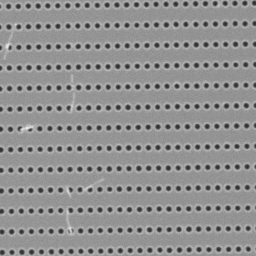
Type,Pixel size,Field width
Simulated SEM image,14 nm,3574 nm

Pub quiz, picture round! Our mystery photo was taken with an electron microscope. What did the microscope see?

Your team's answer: a regular array of holes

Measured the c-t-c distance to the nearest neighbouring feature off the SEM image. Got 134 nanometres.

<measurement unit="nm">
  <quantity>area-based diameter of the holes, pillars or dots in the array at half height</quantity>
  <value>77.2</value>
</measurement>